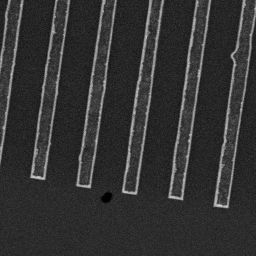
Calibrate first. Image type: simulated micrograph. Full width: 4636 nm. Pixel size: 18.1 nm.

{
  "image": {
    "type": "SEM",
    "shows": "parallel lines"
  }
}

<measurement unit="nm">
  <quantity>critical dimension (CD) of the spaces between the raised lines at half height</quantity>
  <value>596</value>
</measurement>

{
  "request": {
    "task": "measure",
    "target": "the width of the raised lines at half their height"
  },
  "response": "240 nanometres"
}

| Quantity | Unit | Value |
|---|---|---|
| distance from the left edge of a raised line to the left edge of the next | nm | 840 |